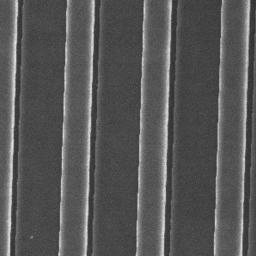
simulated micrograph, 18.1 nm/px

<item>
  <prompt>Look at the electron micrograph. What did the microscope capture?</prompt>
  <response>lines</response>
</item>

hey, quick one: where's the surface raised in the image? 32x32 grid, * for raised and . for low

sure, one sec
**......****......***.......***.
**......****......***.......***.
**......****......***.......***.
**......****......***.......***.
**......****......***.......***.
**......****......***.......***.
**......****......***.......***.
**......****......***.......***.
**......****......***.......***.
**......****......***......****.
**......***.......***......****.
**......***.......***......****.
**......***.......***......****.
**......***.......***......****.
**......***.......***......****.
**......***.......***......****.
**......***.......***......****.
**......***.......***......****.
**......***......****......****.
**......***......****......****.
**......***......****......****.
**......***......****......****.
*.......***......****......***..
*.......***......****......***..
*.......***......****......***..
*.......***......****......***..
*.......***......****......***..
*.......***......****......***..
*.......***......****......***..
*.......***......***.......***..
*......****......***.......***..
*......****......***.......***..